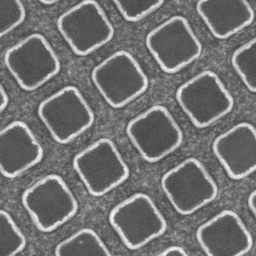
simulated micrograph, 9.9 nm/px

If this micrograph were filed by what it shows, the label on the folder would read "a regular array of raised bodies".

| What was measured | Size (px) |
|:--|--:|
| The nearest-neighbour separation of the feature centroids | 61.9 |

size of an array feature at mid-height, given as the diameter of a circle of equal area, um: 0.488